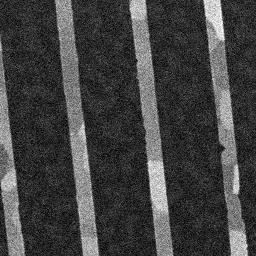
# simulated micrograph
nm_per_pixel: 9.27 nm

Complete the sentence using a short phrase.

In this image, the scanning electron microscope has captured one or a few lines or trenches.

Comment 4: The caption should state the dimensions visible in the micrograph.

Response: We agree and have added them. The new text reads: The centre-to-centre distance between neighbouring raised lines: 681 nm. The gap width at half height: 0.549 um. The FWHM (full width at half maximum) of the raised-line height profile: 137 nm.